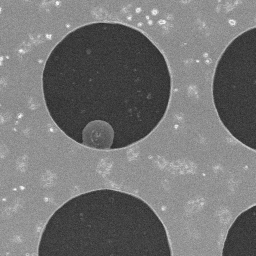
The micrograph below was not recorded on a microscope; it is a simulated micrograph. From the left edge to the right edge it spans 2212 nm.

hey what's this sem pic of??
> holes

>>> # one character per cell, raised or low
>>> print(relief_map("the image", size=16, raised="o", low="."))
oooooooooooooooo
oooooo.ooooooooo
oooo.....oooooo.
ooo.......oooo..
ooo........oo...
ooo........oo...
ooo.......ooo...
ooo.......oooo..
oooo.....oooooo.
oooooooooooooooo
oooooooooooooooo
oooooooooooooooo
oooo.....ooooooo
ooo.......ooooo.
ooo.......oooo..
oo.........ooo..